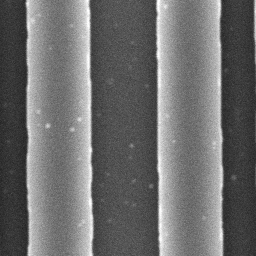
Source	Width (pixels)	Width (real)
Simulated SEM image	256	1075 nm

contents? lines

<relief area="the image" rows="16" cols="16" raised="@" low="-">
--@@@@----@@@@--
--@@@@----@@@@--
--@@@@----@@@@--
--@@@@----@@@@--
--@@@@----@@@@--
--@@@@----@@@@--
--@@@@----@@@@--
--@@@@----@@@@--
--@@@@----@@@@--
--@@@@----@@@@--
--@@@@----@@@@--
--@@@@----@@@@--
--@@@@----@@@@--
--@@@@----@@@@--
--@@@@----@@@@--
--@@@@----@@@@--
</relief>